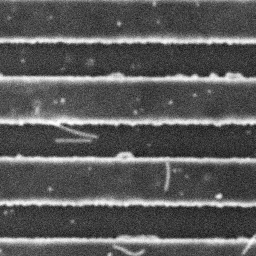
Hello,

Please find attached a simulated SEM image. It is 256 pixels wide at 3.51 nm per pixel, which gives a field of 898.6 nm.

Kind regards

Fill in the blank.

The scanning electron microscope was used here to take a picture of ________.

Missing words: lines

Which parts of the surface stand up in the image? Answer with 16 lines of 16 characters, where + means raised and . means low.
++++++++++++++++
++++++++++++++++
++++++++++++++++
................
................
++++++++++++++++
++++++++++++++++
++++++++++++++++
................
................
++++++++++++++++
++++++++++++++++
++++++++++++++++
................
................
++++++++++++++++